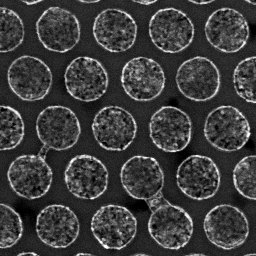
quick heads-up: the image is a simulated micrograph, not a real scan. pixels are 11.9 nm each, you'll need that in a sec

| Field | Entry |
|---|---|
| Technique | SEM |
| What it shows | a regular array of raised bodies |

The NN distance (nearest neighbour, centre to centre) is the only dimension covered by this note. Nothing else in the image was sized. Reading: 668 nanometers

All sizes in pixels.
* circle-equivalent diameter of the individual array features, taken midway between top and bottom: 43.2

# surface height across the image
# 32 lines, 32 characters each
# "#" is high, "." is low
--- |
................................
##....###....##.....###....###..
##...####...#####..#####..#####.
###..#####..#####..#####..#####.
###..#####..#####..#####..#####.
##...####....####..#####...####.
.....................#..........
..###....###.....##.....##.....#
.#####...####...####..#####...##
.#####..#####..######.#####..###
.#####..#####..######.#####..###
..####...####...####...####...##
...##.....##...................#
#.....##.....##.....##.....##...
###..####...####...####...####..
###..#####..#####..#####..#####.
###..#####..#####..#####..#####.
###..#####..#####..#####..#####.
#....###.....###....###....###..
....##....#.....................
.#####...####...####...####...##
.#####..#####..#####..#####..###
.#####..#####..#####..#####..###
..####...####...####...####...##
...##.....##.....###....##.....#
..................###...........
##...####...####...####...####..
###..#####..#####..#####..#####.
###..#####.######..#####..#####.
##...#####..#####..#####..#####.
##....###....###....###....###..
................................